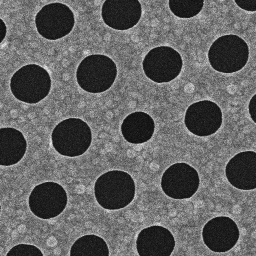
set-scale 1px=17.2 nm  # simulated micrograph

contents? a regular array of holes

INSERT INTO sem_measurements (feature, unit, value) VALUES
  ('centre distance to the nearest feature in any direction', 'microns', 1.14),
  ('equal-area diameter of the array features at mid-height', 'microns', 0.656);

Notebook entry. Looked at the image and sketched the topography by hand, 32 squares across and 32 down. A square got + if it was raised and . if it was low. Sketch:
++++++..+++++.....+++....+++++..
+++++....++++.....+++....+++++++
++++.....++++....+++++++++++++++
.++++....+++++..++++++++++++++++
.++++...++++++++++++++++++++..++
++++++++++++++++++++++++++.....+
+++++++++++++++++++...++++.....+
++++++++++....++++.....+++.....+
+++..+++++.....+++.....++++...++
++....++++.....+++....++++++++++
+.....++++....++++++++++++++++++
+.....+++++..+++++++++++++++++++
++...++++++++++++++++++++++++++.
+++++++++++++++++++++++....++++.
++++++++++++++++...++++.....+++.
+++++++....++++....++++.....++++
...++++....++++....+++++...+++++
...+++.....+++++...+++++++++++++
...++++....+++++++++++++++++++++
...+++++..+++++++++++++++++++...
..++++++++++++++++++++.+++++....
+++++++++++++...+++++....+++....
++++++++++++.....+++.....++++...
++++....++++.....+++.....+++++..
++++....++++.....++++...++++++++
++++....++++....++++++++++++++++
++++....++++++++++++++++++++++++
++++++++++++++++++++++++++...+++
++++++++++++++++++...++++.....++
++++++++++..+++++.....+++.....++
+++++++++....++++.....++++...+++
+....++++.....+++.....+++++.++++